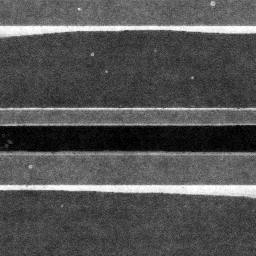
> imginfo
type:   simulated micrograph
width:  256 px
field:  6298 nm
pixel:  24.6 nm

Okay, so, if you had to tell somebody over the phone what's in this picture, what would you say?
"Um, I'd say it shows lines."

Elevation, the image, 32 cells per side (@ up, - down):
@@@@@@@@@@@@@@@@@@@@@@@@@@@@@@@@
@@@@@@@@@@@@@@@@@@@@@@@@@@@@@@@@
@@@@@@@@@@@@@@@@@@@@@@@@@@@@@@@@
@@@@@@@----------------------@--
--------------------------------
--------------------------------
--------------------------------
--------------------------------
--------------------------------
--------------------------------
--------------------------------
--------------------------------
--------------------------------
--------------------------------
@@@@@@@@@@@@@@@@@@@@@@@@@@@@@@@@
@@@@@@@@@@@@@@@@@@@@@@@@@@@@@@@@
--------------------------------
--------------------------------
--------------------------------
@@@@@@@@@@@@@@@@@@@@@@@@@@@@@@@@
@@@@@@@@@@@@@@@@@@@@@@@@@@@@@@@@
@@@@@@@@@@@@@@@@@@@@@@@@@@@@@@@@
@@@@@@@@@@@@@@@@@@@@@@@@@@@@@@@@
---------------------------@@@@@
--------------------------------
--------------------------------
--------------------------------
--------------------------------
--------------------------------
--------------------------------
--------------------------------
--------------------------------